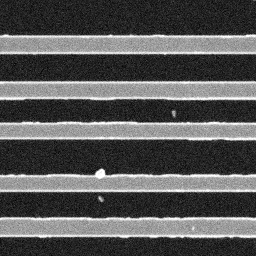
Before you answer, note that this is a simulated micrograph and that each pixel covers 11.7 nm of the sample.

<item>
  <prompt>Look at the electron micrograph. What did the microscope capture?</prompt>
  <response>lines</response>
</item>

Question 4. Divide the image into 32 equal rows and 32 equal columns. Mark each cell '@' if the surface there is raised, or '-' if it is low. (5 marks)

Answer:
--------------------------------
--------------------------------
--------------------------------
--------------------------------
@------------@--@--@@---------@@
@@@@@@@@@@@@@@@@@@@@@@@@@@@@@@@@
@@@@@@@@@@@@@@@@@@@@@@@@@@@@@@@@
--------------------------------
--------------------------------
--------------------------------
@@@@@@@@@@@@@@@@@@@@@@@@@@@@@@@@
@@@@@@@@@@@@@@@@@@@@@@@@@@@@@@@@
--------------------------------
--------------------------------
--------------------------------
@@@@@@@@@@@@@@@@@@@@@@@@@@@@@@@@
@@@@@@@@@@@@@@@@@@@@@@@@@@@@@@@@
--------------------------------
--------------------------------
--------------------------------
--------------------------------
------------@-------------------
@@@@@@@@@@@@@@@@@@@@@@@@@@@@@@@@
@@@@@@@@@@@@@@@@@@@@@@@@@@@@@@@@
--------------------------------
--------------------------------
--------------------------------
@@@@@@@@@@@@@@@@@@@@@@@@@@@@@@@@
@@@@@@@@@@@@@@@@@@@@@@@@@@@@@@@@
@@@@@@@@@@@@@@@@@@@@@@@@@@@@@@@@
--------------------------------
--------------------------------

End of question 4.